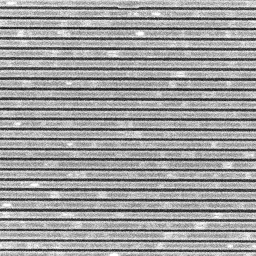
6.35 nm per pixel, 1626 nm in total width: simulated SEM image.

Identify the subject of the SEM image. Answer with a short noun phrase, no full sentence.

parallel lines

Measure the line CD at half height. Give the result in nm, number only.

41.3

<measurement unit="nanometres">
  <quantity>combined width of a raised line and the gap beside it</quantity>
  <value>64.1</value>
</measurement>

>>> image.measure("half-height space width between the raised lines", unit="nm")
23